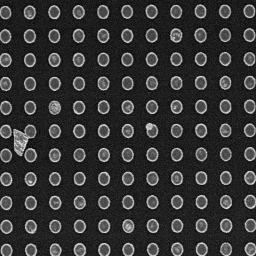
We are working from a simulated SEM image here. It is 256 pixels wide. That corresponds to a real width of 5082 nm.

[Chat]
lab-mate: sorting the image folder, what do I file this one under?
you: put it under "a regular array of raised bodies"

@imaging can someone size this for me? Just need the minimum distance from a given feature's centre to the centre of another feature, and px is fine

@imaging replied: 23.7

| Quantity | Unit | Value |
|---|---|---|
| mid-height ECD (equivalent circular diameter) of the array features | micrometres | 0.235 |